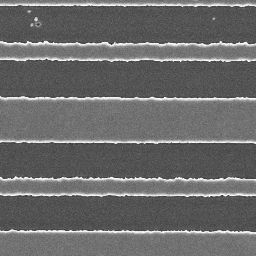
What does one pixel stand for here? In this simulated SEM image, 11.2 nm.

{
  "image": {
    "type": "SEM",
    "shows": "lines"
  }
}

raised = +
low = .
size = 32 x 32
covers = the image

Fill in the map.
++++++++++++++++++++++++++++++++
................................
................................
................................
................................
++++++++++.+++.+++++.++++..++++.
++++++++++++++++++++++++++++++++
..+....+++++++++++.+++++++++++++
................................
................................
................................
................................
++++++++++++++++++++++++++++++++
++++++++++++++++++++++++++++++++
++++++++++++++++++++++++++++++++
++++++++++++++++++++++++++++++++
++++++++++++++++++++++++++++++++
++++++++++++++++++++++++++++++++
................................
................................
................................
................................
++++++++++++++++++++++++++++++++
++++++++++++++++++++++++++++++++
.......................+........
................................
................................
................................
................................
++++++++++++++++++++++++++++++++
++++++++++++++++++++++++++++++++
++++++++++++++++++++++++++++++++